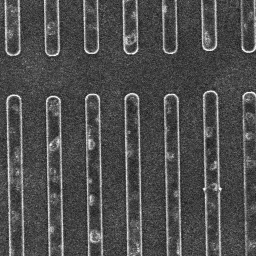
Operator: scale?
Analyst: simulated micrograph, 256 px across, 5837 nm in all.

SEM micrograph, parallel lines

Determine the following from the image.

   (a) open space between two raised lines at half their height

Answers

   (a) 576 nanometres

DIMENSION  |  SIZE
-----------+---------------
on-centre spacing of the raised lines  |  897 nm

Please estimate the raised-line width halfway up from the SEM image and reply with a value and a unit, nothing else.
316 nm